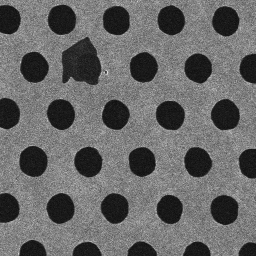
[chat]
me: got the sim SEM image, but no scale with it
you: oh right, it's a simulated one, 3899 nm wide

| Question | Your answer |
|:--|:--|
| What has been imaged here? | a regular array of holes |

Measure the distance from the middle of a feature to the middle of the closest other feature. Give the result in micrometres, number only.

0.826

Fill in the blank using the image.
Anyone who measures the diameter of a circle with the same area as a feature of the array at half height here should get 0.436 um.